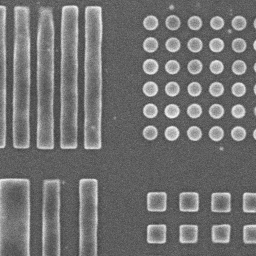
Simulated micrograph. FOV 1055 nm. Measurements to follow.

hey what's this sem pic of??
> groups of lines, slits or small figures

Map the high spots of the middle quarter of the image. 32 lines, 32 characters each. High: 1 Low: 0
11100111100000000000111000111001
11100111100000000000111000111001
11100111100000000000000000000000
11100111100000000000000000000000
11100111100000000000000000000000
11100111100000000000111000111001
11100111100000000000111000111001
11100111100000000000111000110000
11100111100000000000000000000000
11100111100000000000000000000000
11100111100000000000111000110000
11100111100000000000111001111001
11100111100000000000111000110001
11100111100000000000000000000000
11100111100000000000000000000000
11100111100000000000000000000000
11100111100000000000111000110001
11100111100000000000111001111001
11100111100000000000111000110001
11100111100000000000000000000000
11100111100000000000000000000000
00000000000000000000000000000000
00000000000000000000000000000000
00000000000000000000000000000000
00000000000000000000000000000000
00000000000000000000000000000000
00000000000000000000000000000000
00000000000000000000000000000000
00000000000000000000000000000000
00001111000000000000000000000000
00001111000000000000000000000000
00001111000000000000000000000000